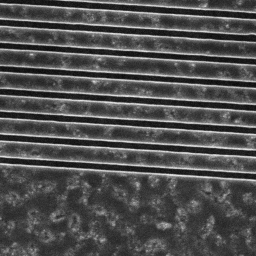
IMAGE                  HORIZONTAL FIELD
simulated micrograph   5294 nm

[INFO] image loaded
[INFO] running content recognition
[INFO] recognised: parallel lines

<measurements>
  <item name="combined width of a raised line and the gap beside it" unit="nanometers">474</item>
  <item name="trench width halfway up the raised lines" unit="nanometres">150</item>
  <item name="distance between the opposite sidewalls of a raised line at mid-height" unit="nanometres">322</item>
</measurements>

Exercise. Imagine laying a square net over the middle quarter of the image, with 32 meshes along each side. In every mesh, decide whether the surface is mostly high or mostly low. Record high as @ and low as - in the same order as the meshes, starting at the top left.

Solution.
@@@@@@@@@@@@@@@@@@@@@@@@@@@@@@@@
-----@@@@@@@@@@@@@@@@@@@@@@@@@@@
---------------------@@@@@@@@@@@
@@@@@---------------------------
@@@@@@@@@@@@@@@@@@@@-@----------
@@@@@@@@@@@@@@@@@@@@@@@@@@@@@@@@
@@@@@@@@@@@@@@@@@@@@@@@@@@@@@@@@
---------@@@@@@@@@@@@@@@@@@@@@@@
-------------------------@@@@@@@
@@@@@@@@@-----------------------
@@@@@@@@@@@@@@@@@@@@@@@@--------
@@@@@@@@@@@@@@@@@@@@@@@@@@@@@@@@
@@@@@@@@@@@@@@@@@@@@@@@@@@@@@@@@
--------------@@@@@@@@@@@@@@@@@@
-----------------------------@@@
@@@@@@@@@@@@@-------------------
@@@@@@@@@@@@@@@@@@@@@@@@@@@@@---
@@@@@@@@@@@@@@@@@@@@@@@@@@@@@@@@
--@@@@@@@@@@@@@@@@@@@@@@@@@@@@@@
------------------@@@@@@@@@@@@@@
@@------------------------------
@@@@@@@@@@@@@@@@@---------------
@@@@@@@@@@@@@@@@@@@@@@@@@@@@@@@@
@@@@@@@@@@@@@@@@@@@@@@@@@@@@@@@@
-------@@@@@@@@@@@@@@@@@@@@@@@@@
----------------------@@@@@@@@@@
@@@@@@--------------------------
@@@@@@@@@@@@@@@@@@@@@@----------
@@@@@@@@@@@@@@@@@@@@@@@@@@@@@@@@
@@@@@@@@@@@@@@@@@@@@@@@@@@@@@@@@
@@@@@@@@@@@@@@@@@@@@@@@@@@@@@@@@
@@@@@@@@@@@@@@@@@@@@@@@@@@@@@@@@